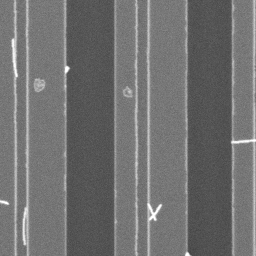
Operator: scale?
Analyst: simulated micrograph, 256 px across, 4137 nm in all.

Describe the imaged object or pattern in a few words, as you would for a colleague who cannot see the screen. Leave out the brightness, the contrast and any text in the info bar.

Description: lines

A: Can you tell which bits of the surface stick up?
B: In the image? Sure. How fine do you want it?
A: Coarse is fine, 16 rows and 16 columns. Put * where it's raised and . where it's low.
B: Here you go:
****...*****...*
****...*****...*
****...*****...*
****...*****...*
****...*****...*
****...*****...*
****...*****...*
****...*****...*
****...*****..**
****...*****...*
****...*****...*
****...*****...*
****...*****...*
****...*****...*
****...*****...*
****...*****...*